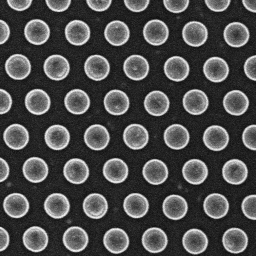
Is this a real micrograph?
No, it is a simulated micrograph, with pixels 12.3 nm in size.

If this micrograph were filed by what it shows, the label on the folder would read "a regular array of raised bodies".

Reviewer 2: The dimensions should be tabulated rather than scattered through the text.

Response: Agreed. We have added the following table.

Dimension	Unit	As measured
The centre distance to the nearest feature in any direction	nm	478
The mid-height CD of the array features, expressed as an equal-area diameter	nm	295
